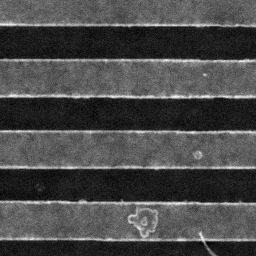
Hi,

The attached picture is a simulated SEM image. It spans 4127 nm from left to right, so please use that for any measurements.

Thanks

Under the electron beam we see lines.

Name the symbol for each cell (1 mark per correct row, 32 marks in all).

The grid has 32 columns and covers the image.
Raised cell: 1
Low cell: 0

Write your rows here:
11111111111111111111111111111111
11111111111111111111111111111111
11111111111111111111111111111111
00000000000000000000000000000000
00000000000000000000000000000000
00000000000000000000000000000000
00000000000000000000000000000000
11111111110111011101000000000000
11111111111111111111111111111111
11111111111111111111111111111111
11111111111111111111111111111111
11111111111111111111111111111111
00000000000000000000000000000000
00000000000000000000000000000000
00000000000000000000000000000000
00000000000000000000000000000000
11111111010001000000000000000000
11111111111111111111111111111111
11111111111111111111111111111111
11111111111111111111111111111111
11111111111111111111111111111111
00000000000000000000000000000000
00000000000000000000000000000000
00000000000000000000000000000000
00000000000000000000000000000000
11111111111111111111111111111111
11111111111111111111111111111111
11111111111111111111111111111111
11111111111111111111111111111111
11111111111111111111111111111111
00000000000000000000000000000000
00000000000000000000000000000000